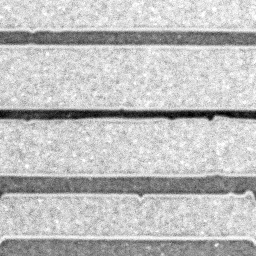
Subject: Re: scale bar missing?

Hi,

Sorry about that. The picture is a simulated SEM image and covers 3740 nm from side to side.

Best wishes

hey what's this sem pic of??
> one or a few lines or trenches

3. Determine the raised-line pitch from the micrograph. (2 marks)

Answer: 1010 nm